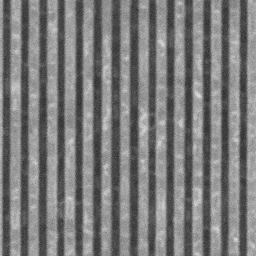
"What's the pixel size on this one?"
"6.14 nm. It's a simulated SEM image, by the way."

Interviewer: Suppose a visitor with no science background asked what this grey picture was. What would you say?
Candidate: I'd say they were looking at parallel lines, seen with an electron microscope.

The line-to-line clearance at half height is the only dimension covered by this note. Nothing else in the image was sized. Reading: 0.056 micrometres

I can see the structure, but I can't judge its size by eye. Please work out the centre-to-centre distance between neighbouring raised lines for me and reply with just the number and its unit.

112 nm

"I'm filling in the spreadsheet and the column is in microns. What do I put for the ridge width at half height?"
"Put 0.056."